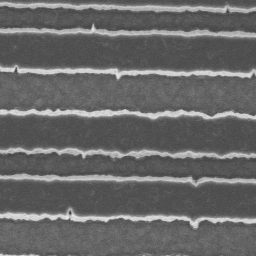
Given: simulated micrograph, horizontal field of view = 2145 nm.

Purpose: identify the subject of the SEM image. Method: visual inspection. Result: one or a few lines or trenches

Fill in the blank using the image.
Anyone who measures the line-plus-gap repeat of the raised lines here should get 612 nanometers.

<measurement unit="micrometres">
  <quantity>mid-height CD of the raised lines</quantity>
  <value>0.341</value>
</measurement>